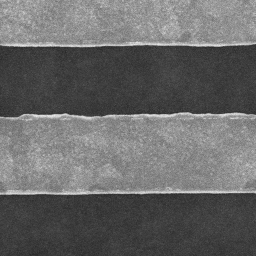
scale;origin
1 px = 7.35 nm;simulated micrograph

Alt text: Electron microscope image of one or a few lines or trenches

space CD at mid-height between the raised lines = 516 nm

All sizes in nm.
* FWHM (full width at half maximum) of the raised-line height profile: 571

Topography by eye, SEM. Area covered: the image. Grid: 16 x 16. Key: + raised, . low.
++++++++++++++++
++++++++++++++++
++++++++++++++++
................
................
................
................
++++++++++++++++
++++++++++++++++
++++++++++++++++
++++++++++++++++
++++++++++++++++
................
................
................
................